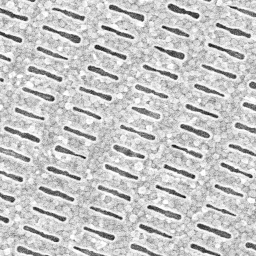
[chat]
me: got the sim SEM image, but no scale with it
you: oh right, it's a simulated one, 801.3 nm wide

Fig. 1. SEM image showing a regular array of holes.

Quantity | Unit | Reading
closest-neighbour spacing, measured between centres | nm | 67.5